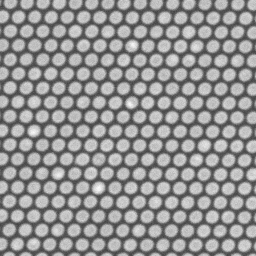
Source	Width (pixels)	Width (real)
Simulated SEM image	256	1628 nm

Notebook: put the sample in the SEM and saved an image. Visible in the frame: a regular array of raised bodies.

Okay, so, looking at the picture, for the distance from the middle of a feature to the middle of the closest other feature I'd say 0.102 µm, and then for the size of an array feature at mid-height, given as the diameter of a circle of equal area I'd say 11.9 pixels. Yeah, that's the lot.